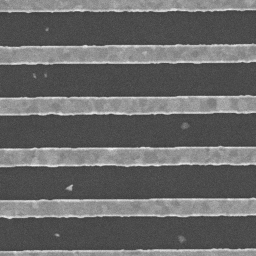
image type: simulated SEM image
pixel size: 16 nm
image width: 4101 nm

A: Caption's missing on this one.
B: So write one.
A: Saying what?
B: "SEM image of lines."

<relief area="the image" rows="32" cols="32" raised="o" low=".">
oooooooooooooooooooooooooooooooo
...o............................
................................
................................
................................
................................
oooooooooooooooooooooooooooooooo
oooooooooooooooooooooooooooooooo
................................
................................
................................
................................
oooooooooooooooooooooooooooooooo
oooooooooooooooooooooooooooooooo
................................
................................
................................
................................
......................oooooooooo
oooooooooooooooooooooooooooooooo
ooooooooooooooooooooooo...oo.oo.
................................
................................
................................
................................
oooooooooooooooooooooooooooooooo
oooooooooooooooooooooooooooooooo
................................
................................
................................
................................
oooooooooooooooooooooooooooooooo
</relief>